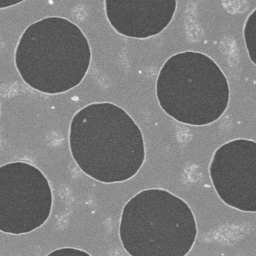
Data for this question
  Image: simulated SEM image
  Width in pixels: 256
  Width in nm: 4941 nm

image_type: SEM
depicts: holes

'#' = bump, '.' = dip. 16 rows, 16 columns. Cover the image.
#######....#####
##...##...#####.
#....##########.
#.....#####..###
#....#####....##
##..######....##
######.###....##
#####...###..###
####.....#######
####.....#####..
..###....####...
...##########...
...#####...###..
...#####....####
..#####.....####
########....####